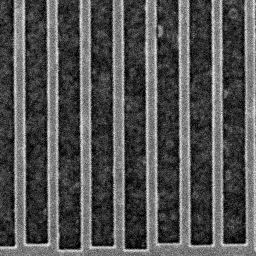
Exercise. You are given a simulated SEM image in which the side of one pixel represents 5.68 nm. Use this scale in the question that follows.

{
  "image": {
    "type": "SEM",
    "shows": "parallel lines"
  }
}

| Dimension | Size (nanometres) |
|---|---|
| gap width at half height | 134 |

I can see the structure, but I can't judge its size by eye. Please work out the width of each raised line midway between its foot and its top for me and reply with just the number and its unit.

54.7 nanometers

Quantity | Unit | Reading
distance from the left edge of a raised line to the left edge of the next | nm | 187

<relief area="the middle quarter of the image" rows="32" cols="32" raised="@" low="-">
----@@@-----@@@------@@------@@-
----@@@-----@@@------@@------@@-
----@@@-----@@@------@@------@@-
----@@@-----@@@------@@------@@-
----@@@-----@@@------@@------@@-
----@@@-----@@@------@@------@@-
----@@@-----@@@------@@------@@-
----@@@-----@@@------@@------@@-
----@@@-----@@@------@@------@@-
----@@@-----@@@------@@------@@-
----@@@-----@@@------@@------@@-
----@@@-----@@@------@@------@@-
----@@@-----@@@------@@------@@-
----@@@------@@------@@------@@-
----@@@------@@------@@------@@-
----@@@------@@------@@------@@-
----@@@------@@------@@------@@-
----@@@------@@------@@------@@-
----@@@------@@------@@------@@-
----@@@------@@------@@------@@-
----@@@------@@------@@------@@-
----@@@------@@------@@------@@-
----@@@------@@------@@------@@-
----@@@------@@------@@------@@-
----@@@------@@------@@------@@-
----@@@------@@------@@------@@-
----@@@------@@------@@------@@-
----@@@------@@------@@------@@-
----@@@------@@------@@------@@-
----@@@------@@------@@------@@-
----@@@------@@------@@------@@-
-----@@------@@------@@------@@-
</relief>